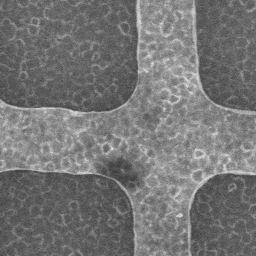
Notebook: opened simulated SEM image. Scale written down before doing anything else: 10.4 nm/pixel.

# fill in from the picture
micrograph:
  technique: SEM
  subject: holes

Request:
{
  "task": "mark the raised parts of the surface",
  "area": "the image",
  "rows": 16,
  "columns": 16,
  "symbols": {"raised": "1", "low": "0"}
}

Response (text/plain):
0000000001110000
0000000001110000
0000000001110000
0000000001110000
0000000001110000
0000000011111000
1000000011111000
1111111111111111
1111111111111111
1111111111111111
1111111111111111
0000000111111000
0000000011110000
0000000011110000
0000000011110000
0000000011110000